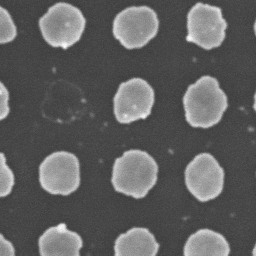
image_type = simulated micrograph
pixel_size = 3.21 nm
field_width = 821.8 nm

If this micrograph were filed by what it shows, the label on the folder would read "a regular array of raised bodies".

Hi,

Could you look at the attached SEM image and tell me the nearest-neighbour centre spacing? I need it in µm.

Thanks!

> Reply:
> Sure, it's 0.228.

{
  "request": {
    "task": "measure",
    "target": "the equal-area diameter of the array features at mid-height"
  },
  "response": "136 nanometres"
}